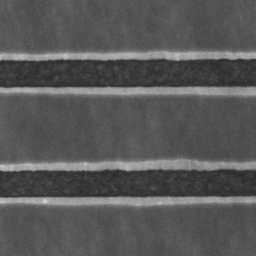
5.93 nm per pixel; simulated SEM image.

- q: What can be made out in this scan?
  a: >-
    lines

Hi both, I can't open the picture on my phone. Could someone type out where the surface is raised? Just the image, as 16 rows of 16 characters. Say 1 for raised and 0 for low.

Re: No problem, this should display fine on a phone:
1111111111111111
1111111111111111
1111111111111111
1111111111110011
0000000000000000
0000000000000000
1111111111111111
1111111111111111
1111111111111111
1111111111111111
1100000000000000
0000000000000000
0010000000001111
1111111111111111
1111111111111111
1111111111111111